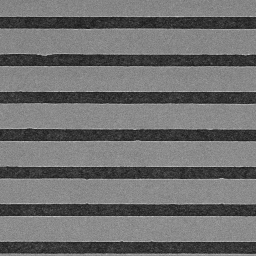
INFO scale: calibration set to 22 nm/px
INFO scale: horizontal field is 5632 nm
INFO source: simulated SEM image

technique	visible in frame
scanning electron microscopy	parallel lines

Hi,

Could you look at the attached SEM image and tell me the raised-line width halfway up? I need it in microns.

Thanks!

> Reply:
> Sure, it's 0.558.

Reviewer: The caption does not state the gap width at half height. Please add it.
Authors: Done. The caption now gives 223 nm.